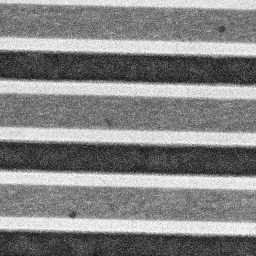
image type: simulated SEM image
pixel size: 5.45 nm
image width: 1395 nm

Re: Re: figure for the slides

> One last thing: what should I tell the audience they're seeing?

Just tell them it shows one or a few lines or trenches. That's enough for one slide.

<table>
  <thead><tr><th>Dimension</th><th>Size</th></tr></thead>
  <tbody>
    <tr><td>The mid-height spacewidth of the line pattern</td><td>41.7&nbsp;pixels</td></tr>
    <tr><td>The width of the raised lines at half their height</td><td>263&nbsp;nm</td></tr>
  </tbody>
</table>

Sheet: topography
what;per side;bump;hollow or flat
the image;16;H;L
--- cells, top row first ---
HHHHHHHHHHHHHHHH
HHHHHHHHHHHHHHHH
HHHHHHHHHHHHHHHH
LLLLLLLLLLLLLLLL
LLLLLLLLLLLLLLLL
HHHHHHLLLLLLLLLL
HHHHHHHHHHHHHHHH
HHHHHHHHHHHHHHHH
LLLLHHHHHHHHHHHH
LLLLLLLLLLLLLLLL
LLLLLLLLLLLLLLLL
HHHHHHHHHHHHHHHH
HHHHHHHHHHHHHHHH
HHHHHHHHHHHHHHHH
LLLLLLLLLLLLLLLL
LLLLLLLLLLLLLLLL